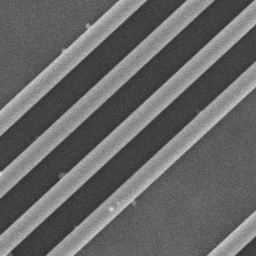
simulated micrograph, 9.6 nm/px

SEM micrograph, groups of lines, slits or small figures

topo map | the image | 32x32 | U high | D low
DDDDDDDDDDDDDDUUUUDDDDDUUUDDDDDU
DDDDDDDDDDDDDUUUUDDDDDUUUDDDDDUU
DDDDDDDDDDDDUUUUDDDDDUUUDDDDDUUU
DDDDDDDDDDDUUUUDDDDDUUUDDDDDUUUD
DDDDDDDDDDUUUDDDDDDUUUDDDDDUUUDD
DDDDDDDDDUUUDDDDDUUUUDDDDDUUUDDD
DDDDDDDDUUUDDDDDUUUUDDDDDUUUDDDD
DDDDDDDUUUDDDDDUUUUDDDDDUUUDDDDD
DDDDDDUUUDDDDDUUUUDDDDDUUUDDDDDU
DDDDDUUUDDDDDUUUUDDDDDUUUDDDDDUU
DDDDUUUDDDDDUUUDDDDDUUUUDDDDDUUU
DDDUUUDDDDDUUUDDDDDUUUUDDDDDUUUD
DUUUUDDDDDUUUDDDDDUUUUDDDDDUUUDD
UUUUDDDDDUUUDDDDDUUUUDDDDDUUUDDD
UUUDDDDDUUUDDDDDUUUUDDDDDUUUDDDD
UUDDDDDUUUDDDDDUUUDDDDDDUUUDDDDD
UDDDDDUUUDDDDDUUUDDDDDUUUUDDDDDD
DDDDDUUUDDDDDUUUDDDDDUUUUDDDDDDD
DDDUUUUDDDDDUUUDDDDDUUUUDDDDDDDD
DDUUUUDDDDDUUUDDDDDUUUUDDDDDDDDD
DUUUUDDDDDUUUDDDDDUUUUDDDDDDDDDD
UUUUDDDDDUUUDDDDDUUUDDDDDDDDDDDD
UUDDDDDDUUUDDDDDUUUDDDDDDDDDDDDD
UDDDDDUUUUDDDDDUUUDDDDDDDDDDDDDD
DDDDDUUUUDDDDDUUUDDDDDDDDDDDDDDD
DDDDUUUUDDDDDUUUDDDDDDDDDDDDDDDD
DDDUUUUDDDDDUUUDDDDDDDDDDDDDDDDD
DDUUUUDDDDDUUUDDDDDDDDDDDDDDDDDU
DUUUDDDDDUUUUDDDDDDDDDDDDDDDDDUU
UUUDDDDDUUUUDDDDDDDDDDDDDDDDDUUU
UUDDDDDUUUUDDDDDDDDDDDDDDDDDUUUD
UDDDDDUUUUDDDDDDDDDDDDDDDDUUUUDD